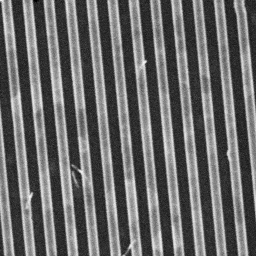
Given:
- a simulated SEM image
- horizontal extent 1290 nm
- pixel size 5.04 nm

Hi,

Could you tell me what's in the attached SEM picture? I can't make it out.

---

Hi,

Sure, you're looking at parallel lines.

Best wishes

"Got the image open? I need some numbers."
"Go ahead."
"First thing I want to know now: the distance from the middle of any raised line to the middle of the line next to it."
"107 nm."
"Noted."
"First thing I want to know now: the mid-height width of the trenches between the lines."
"59.6 nanometres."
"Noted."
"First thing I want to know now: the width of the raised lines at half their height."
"46.4 nm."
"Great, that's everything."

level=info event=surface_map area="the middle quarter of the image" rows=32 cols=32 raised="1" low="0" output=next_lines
00110001100001100011000110000110
00110000110001100011000110000110
00110000110001100011000010000110
00110000110001100011000011000110
00110000110001100011000011000110
00011000110001100001000011000110
00011000110001100001100011000110
00011000110001100001100011000110
00011000110001100001100011000111
00011000110001110001100011000111
00011000110000110001100011000011
00011000111000110001100011000011
00011000111000110001100011000011
00011000011000110001100001100011
00011100011000110001100001100011
00011100011000110000100001100011
00001100011000110000110001100011
00001100011000110000110001100011
00001100011000110000110001100011
10001100011000111000110001100011
10001100011000011000110001100001
10001100011000011000110001100001
10001100011100011000110001100001
10001100001100011000110000100001
10001100001100011000110000110001
10001110001100011000110000110001
10001110001100011000010000110001
11001110001100011000011000110001
11000110001100011000011000110001
11000110001100011100011000110001
11000110001100011100011000110001
11000110001100001100011000110000